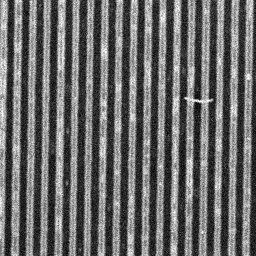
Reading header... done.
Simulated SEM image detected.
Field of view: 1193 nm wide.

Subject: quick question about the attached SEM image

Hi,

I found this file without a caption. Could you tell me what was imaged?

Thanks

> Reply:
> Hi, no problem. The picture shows parallel lines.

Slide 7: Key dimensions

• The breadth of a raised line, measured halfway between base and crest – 0.0274 µm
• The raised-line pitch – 67.3 nm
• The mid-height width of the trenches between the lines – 40.8 nm